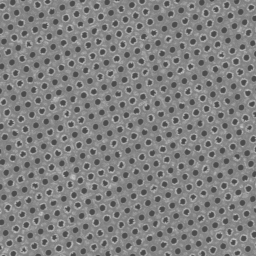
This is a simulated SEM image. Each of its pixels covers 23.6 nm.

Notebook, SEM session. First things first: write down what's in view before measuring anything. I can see a regular array of holes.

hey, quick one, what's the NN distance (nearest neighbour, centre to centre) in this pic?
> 0.256 microns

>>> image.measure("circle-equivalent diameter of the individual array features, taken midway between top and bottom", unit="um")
0.141